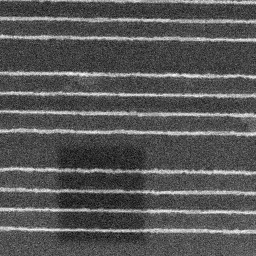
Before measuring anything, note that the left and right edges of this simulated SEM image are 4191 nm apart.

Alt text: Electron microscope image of lines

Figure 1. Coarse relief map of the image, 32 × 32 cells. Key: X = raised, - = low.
--------------------------------
--------------------------------
XXXXXXXXXXXXXXXXXX-X------------
XXXXXXXXXXXXXXXXXXXXXXXXXXXXXXXX
XXXXXXXXXXXXXXXXXXXXXXXXXXXXXXXX
--------------------------------
--------------------------------
--------------------------------
--------------------------------
XXXXXXXXXXXXXXXXXXXXXXXXX-X-XXX-
XXXXXXXXXXXXXXXXXXXXXXXXXXXXXXXX
XXXXXXXXXXXXXXXXXXXXXXXXXXXXXXXX
--------------------------------
--------------------------------
XXXXXXXXXXXXXXXXXXXXXXXXXXXXXXXX
XXXXXXXXXXXXXXXXXXXXXXXXXXXXXXXX
---------XXXXXXXXXXXXXXXXXXXXXXX
--------------------------------
--------------------------------
--------------------------------
--------------------------------
XXXXXXXXXXXXXXXXXXXXX-XX---X----
XXXXXXXXXXXXXXXXXXXXXXXXXXXXXXXX
XXXXXXXXXXXXXXXXXXXXXXXXXXXXXXXX
--------------------------------
--------------------------------
XXXXXXXXXXXXXXXXXXXXXXXX--------
XXXXXXXXXXXXXXXXXXXXXXXXXXXXXXXX
XXXXXXXXXXXXXXXXXXXXXXXXXXXXXXXX
--------------------------------
--------------------------------
--------------------------------